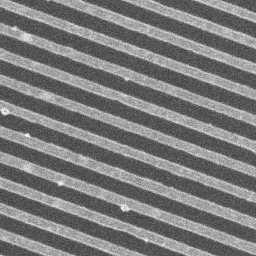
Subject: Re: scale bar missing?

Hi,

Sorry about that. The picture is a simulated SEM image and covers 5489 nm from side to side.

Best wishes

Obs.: parallel lines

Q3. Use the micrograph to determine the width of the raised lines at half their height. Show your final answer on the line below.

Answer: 0.186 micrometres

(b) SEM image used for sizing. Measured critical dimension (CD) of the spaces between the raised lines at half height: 330 nm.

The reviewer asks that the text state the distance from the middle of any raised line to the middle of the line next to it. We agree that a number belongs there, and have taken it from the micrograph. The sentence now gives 519 nanometres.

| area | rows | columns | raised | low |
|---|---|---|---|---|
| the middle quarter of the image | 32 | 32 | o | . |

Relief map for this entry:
.......oooooo............oooooo.
..........oooooo............oooo
o............oooooo...........oo
oooo...........ooooooo..........
ooooooo...........oooooo........
...oooooo............oooooo.....
......oooooo............oooooo..
.........oooooo...........oooooo
...........ooooooo...........ooo
ooo...........oooooo............
oooooo...........oooooo.........
..oooooo...........ooooooo......
.....oooooo...........ooooooo...
.......ooooooo...........oooooo.
..........ooooooo...........oooo
oo...........oooooo............o
oooo...........ooooooo..........
.oooooo............oooooo.......
....oooooo...........ooooooo....
......ooooooo...........oooooo..
.........oooooo............ooooo
o...........oooooo............oo
ooo...........ooooooo...........
oooooo...........ooooooo........
..ooooooo...........oooooo......
....ooooooo............oooooo...
.......oooooooo...........oooooo
..........ooooooo...........oooo
oo...........ooooooo...........o
ooooo..........oooooooo.........
.ooooooo..........ooooooo.......
...ooooooo...........ooooooo....